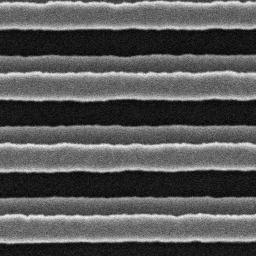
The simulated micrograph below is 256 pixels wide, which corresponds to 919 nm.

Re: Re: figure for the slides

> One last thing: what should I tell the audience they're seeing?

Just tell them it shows lines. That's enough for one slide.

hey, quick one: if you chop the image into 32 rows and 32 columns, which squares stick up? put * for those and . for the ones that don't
********************************
********************************
********************************
********************************
................................
................................
................................
********************************
********************************
********************************
********************************
********************************
...***.*.*****........*.......*.
................................
................................
................................
********************************
********************************
********************************
********************************
********************************
......*.........................
................................
................................
................................
********************************
********************************
********************************
********************************
********************************
................................
................................